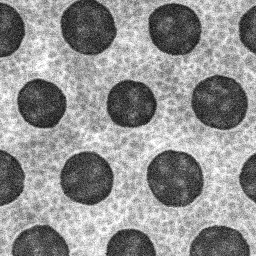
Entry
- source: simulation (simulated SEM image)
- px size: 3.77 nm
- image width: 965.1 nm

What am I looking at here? holes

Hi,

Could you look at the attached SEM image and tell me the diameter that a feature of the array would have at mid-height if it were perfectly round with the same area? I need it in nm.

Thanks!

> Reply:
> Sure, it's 206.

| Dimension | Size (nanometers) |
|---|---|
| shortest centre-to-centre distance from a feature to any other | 325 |